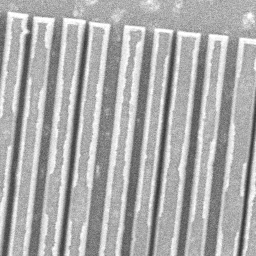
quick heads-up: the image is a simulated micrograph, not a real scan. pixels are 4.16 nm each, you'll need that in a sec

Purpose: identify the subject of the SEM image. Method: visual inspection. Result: parallel lines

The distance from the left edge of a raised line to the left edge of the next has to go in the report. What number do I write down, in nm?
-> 122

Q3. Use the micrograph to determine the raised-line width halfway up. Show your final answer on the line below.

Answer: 0.0766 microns